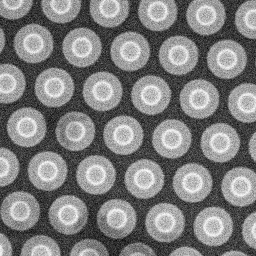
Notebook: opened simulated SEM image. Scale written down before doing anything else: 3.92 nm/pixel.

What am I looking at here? an array of small figures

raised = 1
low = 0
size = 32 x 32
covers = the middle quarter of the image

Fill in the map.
00011100000001111111000001111111
00000000000000011100000001111111
10000001111100000000000000011100
11000011111110000001111100000000
11000111111111000011111110000001
11000111111111000111111111000011
11000111111111000111111111000011
11000111111111000111111111100111
11000111111111000111111111100111
10000011111111000111111111000111
00000011111110000011111111000111
00000000111000000001111110000011
01111000000000000000011000000001
11111100000001111000000000000000
11111110000111111100000001111000
11111110001111111110000111111110
11111111001111111111000111111110
11111111001111111111001111111111
11111110001111111111001111111111
11111110001111111110001111111111
11111100000111111110001111111110
00110000000011111100000111111110
00000000000000110000000011111100
00000011110000000000000000000000
00001111111100000011110000000000
10001111111100001111111100000011
10011111111110001111111100000111
10011111111110011111111110001111
00011111111110011111111110011111
00011111111110011111111110011111
00001111111100001111111110011111
00000111111000001111111100001111